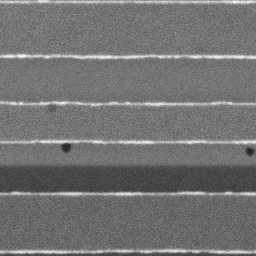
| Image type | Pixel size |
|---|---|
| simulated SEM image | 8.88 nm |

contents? lines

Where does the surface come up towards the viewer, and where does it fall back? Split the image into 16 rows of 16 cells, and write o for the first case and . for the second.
oooooooooooooooo
oooooooooooooooo
oooooooooooooooo
oooooooooooooooo
................
................
o.oooooo.....oo.
oooooooooooooooo
oooooooooooooooo
................
................
................
oooooooooooooooo
oooooooooooooooo
oooooooooooooooo
oooooooooooooooo